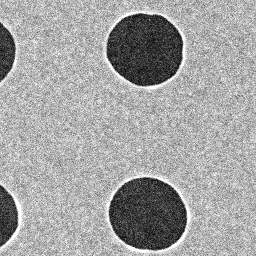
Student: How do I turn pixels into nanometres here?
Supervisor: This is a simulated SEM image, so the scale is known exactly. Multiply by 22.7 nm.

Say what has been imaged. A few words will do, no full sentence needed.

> holes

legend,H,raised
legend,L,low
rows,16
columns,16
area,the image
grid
HHHHHHHHHHHHHHHH
HHHHHHHLLLLHHHHH
LHHHHHHLLLLHHHHH
LHHHHHHLLLLHHHHH
LHHHHHHLLLLHHHHH
HHHHHHHHHHHHHHHH
HHHHHHHHHHHHHHHH
HHHHHHHHHHHHHHHH
HHHHHHHHHHHHHHHH
HHHHHHHHHHHHHHHH
HHHHHHHHHHHHHHHH
HHHHHHHHLLHHHHHH
LHHHHHHLLLLHHHHH
LHHHHHHLLLLLHHHH
LHHHHHHLLLLLHHHH
HHHHHHHHLLHHHHHH